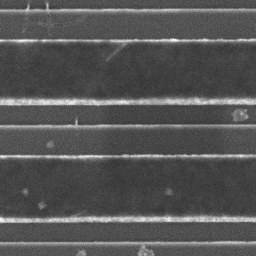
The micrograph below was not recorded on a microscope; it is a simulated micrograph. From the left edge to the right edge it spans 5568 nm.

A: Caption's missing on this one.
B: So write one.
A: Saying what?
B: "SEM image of lines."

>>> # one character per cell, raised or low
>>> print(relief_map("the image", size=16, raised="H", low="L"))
LLLLLLLLLLLLLLLL
LLLLLLLLLLLLLLLL
LLLLLLLLLLHLLLHH
HHHHHHHHHHHHHHHH
HHHHHHHHHHHHHHHH
HHHHHHHHHHHHHHHH
LLLLLLLLLLLLLLLL
LLLLLLLLLLLLLLLL
LLLLLLLLLLLLLLLL
LLLLLLLLLLLLLLLL
HHHHHHHHHHHHHHHH
HHHHHHHHHHHHHHHH
HHHHHHHHHHHHHHHH
HHHHHHHHHHHHHHHH
LLLLLLLLLLLLLLLL
LLLLLLLLLLLLLLLL